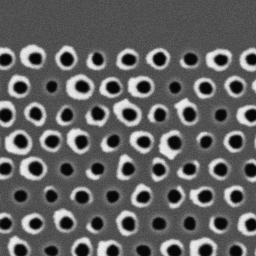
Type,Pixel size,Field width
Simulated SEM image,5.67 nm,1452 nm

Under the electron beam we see a regular array of holes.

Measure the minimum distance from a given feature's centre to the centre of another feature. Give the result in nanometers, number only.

172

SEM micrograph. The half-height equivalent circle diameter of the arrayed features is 0.0709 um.